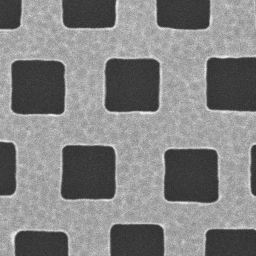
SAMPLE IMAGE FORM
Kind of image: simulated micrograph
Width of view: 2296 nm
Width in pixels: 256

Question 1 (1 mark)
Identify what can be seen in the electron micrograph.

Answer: holes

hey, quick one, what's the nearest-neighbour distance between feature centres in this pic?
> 860 nanometres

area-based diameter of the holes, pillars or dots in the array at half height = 0.545 microns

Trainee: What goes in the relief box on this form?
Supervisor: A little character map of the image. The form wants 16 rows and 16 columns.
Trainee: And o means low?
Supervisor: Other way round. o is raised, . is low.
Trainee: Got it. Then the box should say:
.ooo...ooo...ooo
.ooo...ooo...ooo
oooooooooooooooo
oooooooooooooooo
o...ooo...ooo...
o...ooo...ooo...
o...ooo...ooo...
oooooooooooooooo
oooooooooooooooo
.ooo...ooo...ooo
.ooo...ooo....oo
.ooo...ooo....oo
ooooooooooo..ooo
oooooooooooooooo
o...ooo...ooo...
o...ooo...ooo...